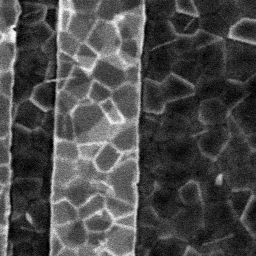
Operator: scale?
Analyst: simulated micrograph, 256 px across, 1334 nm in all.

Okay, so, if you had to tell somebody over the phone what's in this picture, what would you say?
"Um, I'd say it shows one or a few lines or trenches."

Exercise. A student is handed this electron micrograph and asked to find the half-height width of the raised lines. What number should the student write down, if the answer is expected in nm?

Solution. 435